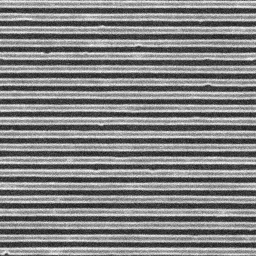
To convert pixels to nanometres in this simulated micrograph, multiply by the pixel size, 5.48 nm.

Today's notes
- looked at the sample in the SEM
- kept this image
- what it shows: parallel lines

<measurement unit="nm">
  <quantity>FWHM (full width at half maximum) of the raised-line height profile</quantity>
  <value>36.3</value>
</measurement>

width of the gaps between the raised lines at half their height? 0.037 micrometres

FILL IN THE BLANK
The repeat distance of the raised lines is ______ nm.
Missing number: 71.4